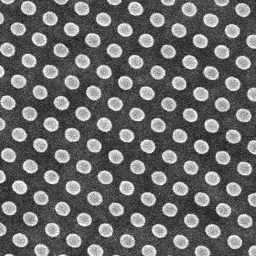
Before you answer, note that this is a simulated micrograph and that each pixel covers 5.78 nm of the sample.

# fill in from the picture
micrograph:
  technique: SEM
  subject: a regular array of raised bodies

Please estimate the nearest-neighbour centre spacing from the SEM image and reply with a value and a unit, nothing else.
135 nm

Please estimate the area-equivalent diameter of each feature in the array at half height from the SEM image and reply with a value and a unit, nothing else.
0.0793 micrometres